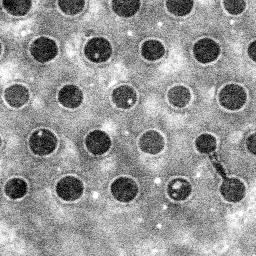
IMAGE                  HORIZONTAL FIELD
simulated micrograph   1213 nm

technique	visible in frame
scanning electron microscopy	a regular array of raised bodies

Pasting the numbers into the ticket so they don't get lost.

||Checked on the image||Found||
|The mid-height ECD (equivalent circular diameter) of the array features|134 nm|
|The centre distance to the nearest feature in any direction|252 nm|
